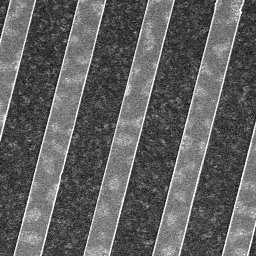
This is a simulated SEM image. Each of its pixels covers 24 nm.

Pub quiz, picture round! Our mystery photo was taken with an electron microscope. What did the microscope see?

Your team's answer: one or a few lines or trenches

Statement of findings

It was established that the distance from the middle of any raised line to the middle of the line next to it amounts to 1600 nanometres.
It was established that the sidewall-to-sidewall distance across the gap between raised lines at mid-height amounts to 1.02 micrometres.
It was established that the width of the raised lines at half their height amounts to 598 nanometres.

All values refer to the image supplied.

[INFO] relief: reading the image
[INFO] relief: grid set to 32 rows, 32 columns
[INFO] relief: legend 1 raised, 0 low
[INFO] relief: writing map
01110000001110000011110000011100
01110000011110000011100000011100
01110000011110000011100000011100
11110000011100000011100000111100
11100000011100000111100000111000
11100000111100000111000000111000
11100000111100000111000001111000
11100000111000000111000001111000
11000000111000001111000001110000
11000001111000001110000001110000
11000001111000001110000011110000
10000001110000001110000011110000
10000001110000011110000011100000
10000011110000011100000011100000
10000011110000011100000011100000
00000011100000011100000111100000
00000011100000111100000111000000
00000111100000111000000111000001
00000111000000111000001111000001
00000111000000111000001111000001
00000111000001111000001110000001
00001111000001110000001110000011
00001110000001110000001110000011
00001110000001110000011100000011
00001110000011110000011100000011
00011110000011100000011100000111
00011100000011100000011100000111
00011100000011100000111100000111
00011100000111100000111000000111
00111100000111000000111000001111
00111000000111000001111000001110
00111000000111000001111000001110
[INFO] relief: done